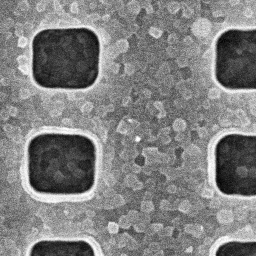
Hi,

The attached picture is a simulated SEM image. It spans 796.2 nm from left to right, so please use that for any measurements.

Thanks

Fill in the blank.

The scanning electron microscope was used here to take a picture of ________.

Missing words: holes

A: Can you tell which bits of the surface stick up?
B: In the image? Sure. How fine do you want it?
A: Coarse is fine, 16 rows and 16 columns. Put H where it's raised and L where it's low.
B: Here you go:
HHHHHHHHHHHHHHHH
HHHHHHHHHHHHHHHH
HHLLLLHHHHHHHHLL
HHLLLLHHHHHHHLLL
HHLLLLHHHHHHHLLL
HHHLLHHHHHHHHHLL
HHHHHHHHHHHHHHHH
HHHHHHHHHHHHHHHH
HHLLLHHHHHHHHHLL
HHLLLLHHHHHHHLLL
HHLLLLHHHHHHHLLL
HHLLLLHHHHHHHHLL
HHHHHHHHHHHHHHHH
HHHHHHHHHHHHHHHH
HHHHHHHHHHHHHHHH
HHLLLLHHHHHHHHLL